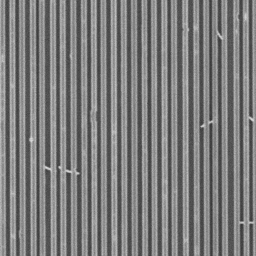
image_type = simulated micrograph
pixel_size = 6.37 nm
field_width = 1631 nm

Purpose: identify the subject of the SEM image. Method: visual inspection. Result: parallel lines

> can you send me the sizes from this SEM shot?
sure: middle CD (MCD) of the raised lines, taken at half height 28.7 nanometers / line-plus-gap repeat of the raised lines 0.0646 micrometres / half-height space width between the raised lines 5.37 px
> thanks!